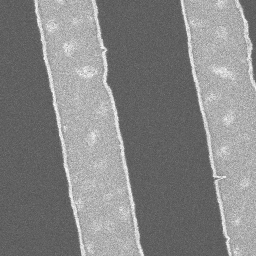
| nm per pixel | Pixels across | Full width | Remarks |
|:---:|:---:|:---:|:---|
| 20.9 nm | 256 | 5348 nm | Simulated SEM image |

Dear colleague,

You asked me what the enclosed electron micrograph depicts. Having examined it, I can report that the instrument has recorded one or a few lines or trenches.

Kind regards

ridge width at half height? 1830 nanometers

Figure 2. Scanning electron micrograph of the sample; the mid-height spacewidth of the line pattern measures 1170 nanometres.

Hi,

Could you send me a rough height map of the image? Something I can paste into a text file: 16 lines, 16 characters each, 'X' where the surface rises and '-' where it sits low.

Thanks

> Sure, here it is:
XX----XXXXX----X
XXX---XXXXXX---X
XXX---XXXXXX---X
XXX----XXXXX----
XXX----XXXXX----
XXX----XXXXX----
XXX----XXXXXX---
XXXX---XXXXXX---
XXXX---XXXXXX---
XXXX----XXXXX---
XXXX----XXXXX---
XXXX----XXXXXX--
XXXXX---XXXXXX--
XXXXX---XXXXXX--
XXXXX----XXXXX--
XXXXX----XXXXX--